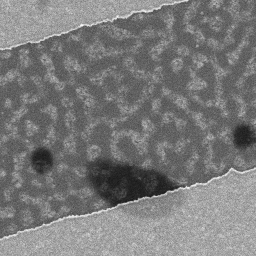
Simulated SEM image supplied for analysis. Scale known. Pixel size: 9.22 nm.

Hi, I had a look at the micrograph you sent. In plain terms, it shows one or a few lines or trenches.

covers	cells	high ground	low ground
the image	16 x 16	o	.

oooooooooo......
oooooo..........
ooo.............
................
................
................
................
................
................
................
................
............oooo
.........ooooooo
.....ooooooooooo
.ooooooooooooooo
oooooooooooooooo